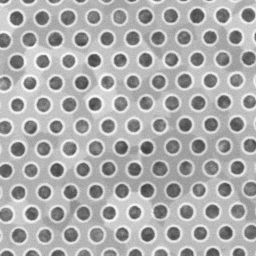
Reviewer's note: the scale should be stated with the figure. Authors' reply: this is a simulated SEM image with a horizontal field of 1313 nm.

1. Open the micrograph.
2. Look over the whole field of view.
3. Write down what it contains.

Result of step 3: a regular array of holes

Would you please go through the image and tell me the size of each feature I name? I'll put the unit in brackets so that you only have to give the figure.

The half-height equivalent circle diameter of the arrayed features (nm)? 78.1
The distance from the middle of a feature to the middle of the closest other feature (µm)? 0.127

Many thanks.